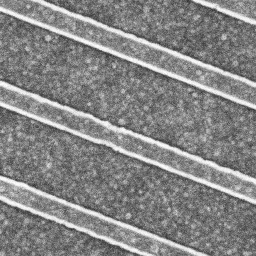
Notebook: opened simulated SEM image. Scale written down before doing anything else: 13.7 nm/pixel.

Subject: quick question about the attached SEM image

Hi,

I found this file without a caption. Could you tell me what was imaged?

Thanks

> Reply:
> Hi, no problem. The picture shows one or a few lines or trenches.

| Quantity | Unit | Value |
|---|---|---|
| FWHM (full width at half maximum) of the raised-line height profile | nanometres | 280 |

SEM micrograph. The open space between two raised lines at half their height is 926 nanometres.